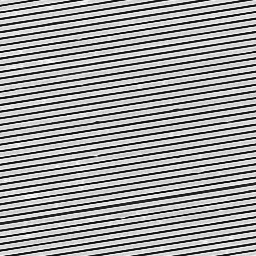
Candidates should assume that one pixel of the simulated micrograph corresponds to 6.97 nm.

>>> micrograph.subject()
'parallel lines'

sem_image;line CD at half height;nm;31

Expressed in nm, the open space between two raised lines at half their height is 12.9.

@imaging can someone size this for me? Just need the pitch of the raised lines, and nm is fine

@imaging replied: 45.6